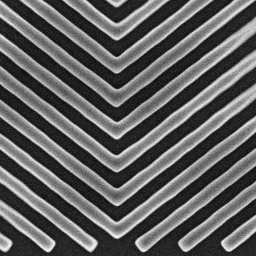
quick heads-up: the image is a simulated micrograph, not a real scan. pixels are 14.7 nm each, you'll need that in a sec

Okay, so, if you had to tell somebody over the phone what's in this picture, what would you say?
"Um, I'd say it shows groups of lines, slits or small figures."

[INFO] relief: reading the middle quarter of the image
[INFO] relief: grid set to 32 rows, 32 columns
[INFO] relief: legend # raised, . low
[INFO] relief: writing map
#####.....######.....######.....
.#####......###.....#####......#
..######...........#####.....###
....#####.........#####.....####
.....#####......######.....#####
#.....######...#####.....######.
##.....############.....#####...
####.....########......#####....
#####.....######......#####.....
.#####.....####.....######......
..#####......#.....######.....##
...######.........#####......###
.....#####......######.....#####
......#####....#####......#####.
##.....######.#####......#####..
###......#########......####....
####......######.......####.....
######.....####......#####......
..#####.............####......##
...#####...........####......###
....#####........#####......####
.....######.....#####......#####
#......#####..#####......#####..
###.....##########......#####...
####.....########......#####....
#####......#####......####......
.######.....##......#####.....##
...#####..........#####......###
....#####........#####......####
.....######.....#####......#####
#.....######...#####.....######.
###.....##########......#####...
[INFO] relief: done